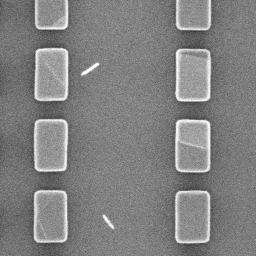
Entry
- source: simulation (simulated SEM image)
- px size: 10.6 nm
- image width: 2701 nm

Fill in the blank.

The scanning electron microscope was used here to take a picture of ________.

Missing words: wiring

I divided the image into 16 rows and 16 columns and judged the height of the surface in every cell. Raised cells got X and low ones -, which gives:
--XX-------XX---
--XX-------XX---
----------------
--XX-------XX---
--XX-------XX---
--XX-------XX---
----------------
----------------
--XX-------XX---
--XX-------XX---
--XX-------XX---
----------------
--XX-------XX---
--XX-------XX---
--XX-------XX---
----------------